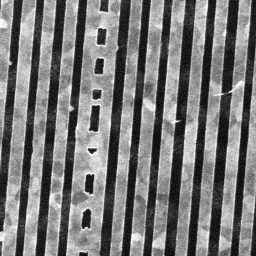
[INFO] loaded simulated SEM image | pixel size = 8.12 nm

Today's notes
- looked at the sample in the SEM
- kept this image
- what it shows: parallel lines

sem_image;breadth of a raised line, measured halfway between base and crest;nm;93.1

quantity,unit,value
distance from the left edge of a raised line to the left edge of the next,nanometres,175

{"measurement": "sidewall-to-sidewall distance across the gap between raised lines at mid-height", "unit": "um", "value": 0.0759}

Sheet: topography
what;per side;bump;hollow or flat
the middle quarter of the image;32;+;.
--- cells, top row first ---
++...+++..+++...++...+++..+++...
++...++...+++..+++...++...+++...
++..++++..++...+++..+++...+++...
++..++++++++...+++..+++...+++...
++..++++++++...+++..+++...+++..+
++..++++++++...+++..+++...++...+
++..+++..+++...+++..+++..+++...+
+...+++..+++...+++..+++..+++...+
+...+++..+++...++...+++..+++...+
+...++++++++...++...+++..+++...+
+...+++..+++...++...+++..+++...+
+...+++..+++...++...+++..+++...+
+...+++..+++...++...+++..+++...+
+...++...+++...++...++...+++...+
+...++...++...+++..+++...+++...+
+..+++...++...+++..+++...+++...+
+..+++...++...+++..+++...+++..++
+..++++++++...+++..+++...++...++
+..++++++++...+++..+++..+++...++
...++++++++...++...+++..+++...++
...++++++++...++...+++..+++...++
...+++..+++...++...+++..+++...++
...++++++++...++...+++..+++...++
...++++++++...++...+++..+++...++
...++++++++...++...+++..+++...++
...++++++++...++...++...+++...++
..+++++++++..+++..+++...+++...++
..++++..++...+++..+++...++....++
..+++...++...+++..+++...++....++
..+++...++...+++..+++...++...+++
..+++...++...+++..+++..+++...+++
..+++..+++...+++..+++..+++...+++